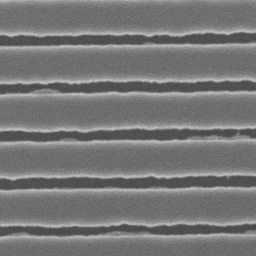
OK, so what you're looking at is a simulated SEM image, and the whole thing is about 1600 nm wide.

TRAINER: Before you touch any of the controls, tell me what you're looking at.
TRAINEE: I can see lines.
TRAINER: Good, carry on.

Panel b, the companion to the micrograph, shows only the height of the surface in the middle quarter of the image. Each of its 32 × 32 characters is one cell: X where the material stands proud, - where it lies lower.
XXXXXXXXXXXXXXXXXXXXXXXXXXXXXXXX
XXXXXXXXXXXXXXXXXXXXXXXXXXXXXXXX
XXXXXXXXXXXXXXXXXXXXXXXXXXXXXXXX
XXXXXXXXXXXXXXXXXXXXXXXXXXXXXXXX
-XXX-X-----------------X--------
--------------------------------
--------------------------------
XXXXXXXXXXXXXXXXXXXXXXXXXXXXXXXX
XXXXXXXXXXXXXXXXXXXXXXXXXXXXXXXX
XXXXXXXXXXXXXXXXXXXXXXXXXXXXXXXX
XXXXXXXXXXXXXXXXXXXXXXXXXXXXXXXX
XXXXXXXXXXXXXXXXXXXXXXXXXXXXXXXX
XXXXXXXXXXXXXXXXXXXXXXXXXXXXXXXX
XXXXXXXXXXXXXXXXXXXXXXXXXXXXXXXX
XXXXXXXXXXXXXXXXXXXXXXXXXXXXXXXX
XXXXXXXXXXXXXXXXXXXXXXXXXXXXXXXX
XXXXXXXX------------------------
--------------------------------
--------------------------------
------XXXXXXXXXXXXXXXXXXXXXXXXXX
XXXXXXXXXXXXXXXXXXXXXXXXXXXXXXXX
XXXXXXXXXXXXXXXXXXXXXXXXXXXXXXXX
XXXXXXXXXXXXXXXXXXXXXXXXXXXXXXXX
XXXXXXXXXXXXXXXXXXXXXXXXXXXXXXXX
XXXXXXXXXXXXXXXXXXXXXXXXXXXXXXXX
XXXXXXXXXXXXXXXXXXXXXXXXXXXXXXXX
XXXXXXXXXXXXXXXXXXXXXXXXXXXXXXXX
XXXXXXXXXXXXXXXXXXXXXXXXXXXXXXXX
--------------------------------
--------------------------------
--------------------------------
XXXXXXXXXXXXXXXXXXXXXXXXXXXXXXXX